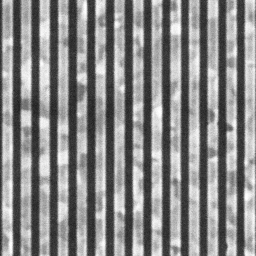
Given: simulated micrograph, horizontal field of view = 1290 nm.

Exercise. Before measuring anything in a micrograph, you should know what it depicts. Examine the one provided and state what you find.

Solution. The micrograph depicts parallel lines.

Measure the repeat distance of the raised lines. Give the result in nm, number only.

94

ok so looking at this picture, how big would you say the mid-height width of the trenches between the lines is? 0.0498 microns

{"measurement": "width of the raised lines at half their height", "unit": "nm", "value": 44.7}